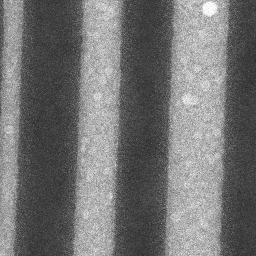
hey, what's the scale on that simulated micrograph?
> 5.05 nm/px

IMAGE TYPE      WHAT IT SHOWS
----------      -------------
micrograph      one or a few lines or trenches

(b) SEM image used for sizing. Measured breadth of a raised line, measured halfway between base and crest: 294 nm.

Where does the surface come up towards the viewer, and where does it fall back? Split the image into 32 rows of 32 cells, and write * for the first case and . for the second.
*..********....*******....*.****
*..*******...*.*******....*.****
*..********....*******......****
*..********....*******......****
*..*******.*...*******...*..****
*..*******.....*******......****
...********....*******......****
..*********....*******......****
..********.....*******......****
..********.....*******.*....****
..********.....*******......****
..********.....******.......****
..********..*..******..**...****
..********.....******.......****
..********.....******.......****
..********.....******.......****
..********.....******......*****
..*********....******.......****
..********....*******.......****
..********....*******......*****
..********....*******.......****
..********.*.********.......****
..********....*******.......****
..********....*******.......****
..********....*******......*****
..********....*******.......****
..********....*******.......****
..********....*******......*****
..********....*******......*****
..********....*******......*****
.********.....*******......*****
..*******.....*******......*****